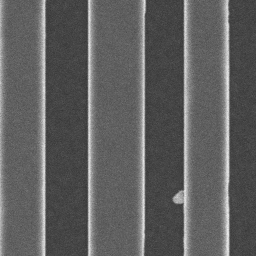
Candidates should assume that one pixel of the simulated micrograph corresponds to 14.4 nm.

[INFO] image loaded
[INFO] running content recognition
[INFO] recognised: lines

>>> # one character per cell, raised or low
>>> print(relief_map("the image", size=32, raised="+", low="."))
++++++.....+++++++.....+++++....
++++++.....+++++++.....+++++....
++++++.....+++++++.....+++++....
++++++.....+++++++.....+++++....
++++++.....+++++++.....+++++....
++++++.....+++++++.....+++++....
++++++.....+++++++.....+++++....
++++++.....+++++++.....+++++....
++++++.....+++++++.....+++++....
++++++.....+++++++.....+++++....
++++++.....+++++++.....+++++....
++++++.....+++++++.....+++++....
++++++.....+++++++.....++++++...
++++++.....+++++++.....++++++...
++++++.....+++++++.....+++++....
++++++.....+++++++.....++++++...
++++++.....+++++++.....+++++....
++++++.....+++++++.....+++++....
++++++.....+++++++.....+++++....
++++++.....+++++++.....+++++....
++++++.....+++++++.....+++++....
++++++.....+++++++.....+++++....
++++++.....+++++++.....+++++....
++++++.....+++++++.....+++++....
++++++.....+++++++.....+++++....
++++++.....+++++++.....+++++....
++++++.....+++++++.....+++++....
++++++.....+++++++.....+++++....
++++++.....+++++++.....+++++....
++++++.....+++++++.....++++++...
++++++.....+++++++.....+++++....
++++++.....+++++++.....+++++....